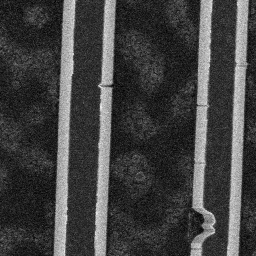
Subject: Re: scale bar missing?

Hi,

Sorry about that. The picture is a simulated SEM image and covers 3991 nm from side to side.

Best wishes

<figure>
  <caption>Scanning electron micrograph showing one or a few lines or trenches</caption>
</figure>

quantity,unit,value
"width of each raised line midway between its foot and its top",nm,611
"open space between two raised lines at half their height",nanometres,1490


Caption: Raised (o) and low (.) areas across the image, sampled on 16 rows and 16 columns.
....ooo......oo.
....ooo......oo.
....ooo......oo.
....ooo......oo.
....ooo......oo.
....ooo......oo.
....ooo......oo.
....ooo......oo.
....ooo......oo.
....ooo.....ooo.
....oo......ooo.
....oo......ooo.
....oo......ooo.
....oo.......oo.
....oo.......oo.
....oo......ooo.